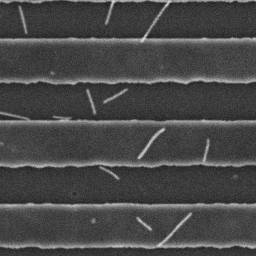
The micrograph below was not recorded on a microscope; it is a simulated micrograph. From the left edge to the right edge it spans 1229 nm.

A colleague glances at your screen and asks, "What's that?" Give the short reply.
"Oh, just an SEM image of lines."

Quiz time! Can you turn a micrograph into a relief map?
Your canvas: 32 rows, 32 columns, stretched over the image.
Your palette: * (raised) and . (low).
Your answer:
................................
................................
................................
................................
................................
********************************
********************************
********************************
********************************
********************************
.......*........................
................................
................................
................................
................................
********************************
********************************
********************************
********************************
********************************
********************************
................................
................................
................................
................................
...****......*****......******.*
********************************
********************************
********************************
********************************
********************************
................................